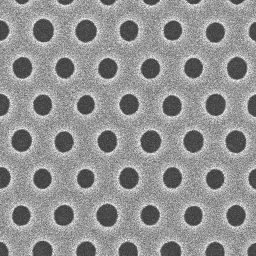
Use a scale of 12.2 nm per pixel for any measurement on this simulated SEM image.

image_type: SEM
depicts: a regular array of holes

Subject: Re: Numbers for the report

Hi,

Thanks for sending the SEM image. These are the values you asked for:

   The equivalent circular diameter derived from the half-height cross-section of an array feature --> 253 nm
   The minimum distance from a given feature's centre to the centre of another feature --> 0.514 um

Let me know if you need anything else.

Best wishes